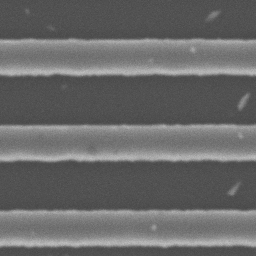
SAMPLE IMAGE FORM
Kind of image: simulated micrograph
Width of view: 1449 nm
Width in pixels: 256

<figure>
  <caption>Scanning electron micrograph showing lines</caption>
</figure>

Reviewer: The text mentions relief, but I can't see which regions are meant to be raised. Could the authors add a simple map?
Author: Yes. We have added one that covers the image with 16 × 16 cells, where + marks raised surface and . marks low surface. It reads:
................
................
.++.+....++.+...
++++++++++++++++
++++++++++++++++
................
................
................
++++++++++++++++
++++++++++++++++
................
................
................
++++++++++++++++
++++++++++++++++
................